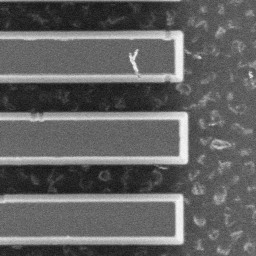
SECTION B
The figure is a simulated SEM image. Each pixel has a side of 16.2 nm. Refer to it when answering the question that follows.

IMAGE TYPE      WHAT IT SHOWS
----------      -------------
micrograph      one or a few lines or trenches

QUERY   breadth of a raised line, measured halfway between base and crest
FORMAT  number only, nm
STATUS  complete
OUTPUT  708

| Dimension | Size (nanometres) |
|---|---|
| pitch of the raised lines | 1320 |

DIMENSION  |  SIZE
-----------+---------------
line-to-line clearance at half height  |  599 nanometres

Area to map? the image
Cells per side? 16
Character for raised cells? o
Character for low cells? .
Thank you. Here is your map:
................
................
ooooooooooo.....
ooooooooooo.....
ooooooooooo.....
................
................
ooooooooooo.....
ooooooooooo.....
ooooooooooo.....
................
................
ooooooooooo.....
ooooooooooo.....
ooooooooooo.....
................